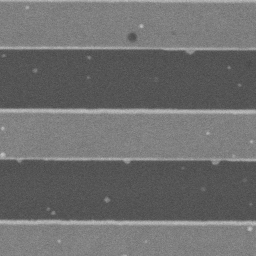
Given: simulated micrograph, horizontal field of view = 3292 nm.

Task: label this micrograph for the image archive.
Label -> lines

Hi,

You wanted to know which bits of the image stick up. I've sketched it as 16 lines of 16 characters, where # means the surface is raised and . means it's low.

################
################
################
................
................
................
................
################
################
################
................
................
................
................
################
################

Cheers